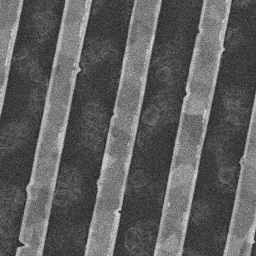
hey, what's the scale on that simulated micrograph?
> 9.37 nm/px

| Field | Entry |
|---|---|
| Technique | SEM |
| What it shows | one or a few lines or trenches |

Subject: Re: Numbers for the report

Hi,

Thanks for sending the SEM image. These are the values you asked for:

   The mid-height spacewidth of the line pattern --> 417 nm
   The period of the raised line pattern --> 0.638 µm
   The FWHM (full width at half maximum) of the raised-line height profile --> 222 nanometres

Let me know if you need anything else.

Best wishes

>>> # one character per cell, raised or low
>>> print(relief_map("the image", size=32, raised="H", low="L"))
HHHLLLLLHHHLLLLLLHHHLLLLLLHHHLLL
HHLLLLLLHHHLLLLLLHHHLLLLLHHHHLLL
HHLLLLLLHHHLLLLLHHHHLLLLLHHHLLLL
HHLLLLLLHHHLLLLLHHHLLLLLLHHHLLLL
HHLLLLLLHHLLLLLLHHHLLLLLLHHHLLLL
HHLLLLLHHHLLLLLLHHHLLLLLLHHHLLLL
HLLLLLLHHHLLLLLLHHHLLLLLHHHHLLLL
HLLLLLLHHHLLLLLLHHHLLLLLHHHLLLLL
HLLLLLLHHHLLLLLHHHLLLLLLHHHLLLLL
HLLLLLLHHLLLLLLHHHLLLLLLHHHLLLLL
HLLLLLHHHLLLLLLHHHLLLLLHHHHLLLLL
LLLLLLHHHLLLLLLHHHLLLLLHHHHLLLLL
LLLLLLHHHLLLLLLHHHLLLLLHHHLLLLLL
LLLLLLHHHLLLLLHHHLLLLLLHHHLLLLLL
LLLLLLHHLLLLLLHHHLLLLLLHHHLLLLLL
LLLLLHHHLLLLLLHHHLLLLLLHHHLLLLLH
LLLLLHHHLLLLLLHHHLLLLLHHHHLLLLLH
LLLLLHHHLLLLLLHHHLLLLLHHHLLLLLLH
LLLLLHHHLLLLLHHHHLLLLLHHHLLLLLLH
LLLLHHHLLLLLLHHHLLLLLLHHHLLLLLHH
LLLLHHHLLLLLLHHHLLLLLLHHHLLLLLHH
LLLLHHHLLLLLLHHHLLLLLHHHLLLLLLHH
LLLLHHHLLLLLHHHHLLLLLHHHLLLLLLHH
LLLLHHHLLLLLHHHHLLLLLHHHLLLLLLHH
LLLLHHHLLLLLHHHLLLLLLHHHLLLLLLHH
LLLHHHLLLLLLHHHLLLLLLHHHLLLLLHHH
LLLHHHLLLLLLHHHLLLLLHHHHLLLLLHHH
LLLHHHLLLLLLHHHLLLLLHHHLLLLLLHHH
LLLHHHLLLLLHHHHLLLLLHHHLLLLLLHHH
LLLHHHLLLLLHHHLLLLLLHHHLLLLLLHHH
LLLHHLLLLLLHHHLLLLLLHHHLLLLLHHHL
LLHHHLLLLLLHHHLLLLLLHHHLLLLLHHHL